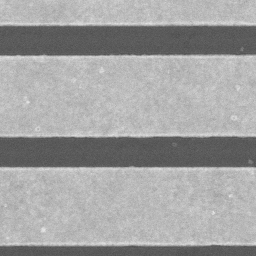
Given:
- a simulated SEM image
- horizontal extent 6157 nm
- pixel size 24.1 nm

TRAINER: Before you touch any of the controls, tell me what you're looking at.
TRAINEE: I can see lines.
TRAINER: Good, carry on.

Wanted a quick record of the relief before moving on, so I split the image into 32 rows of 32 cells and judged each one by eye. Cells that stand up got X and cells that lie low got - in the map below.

XXXXXXXXXXXXXXXXXXXXXXXXXXXXXXXX
XXXXXXXXXXXXXXXXXXXXXXXXXXXXXXXX
XXXXXXXXXXXXXXXXXXXXXXXXXXXXXXXX
--------------------------------
--------------------------------
--------------------------------
--------------------------------
XXXXXXXXXXXXXXXXXXXXXXXXXXXXXXXX
XXXXXXXXXXXXXXXXXXXXXXXXXXXXXXXX
XXXXXXXXXXXXXXXXXXXXXXXXXXXXXXXX
XXXXXXXXXXXXXXXXXXXXXXXXXXXXXXXX
XXXXXXXXXXXXXXXXXXXXXXXXXXXXXXXX
XXXXXXXXXXXXXXXXXXXXXXXXXXXXXXXX
XXXXXXXXXXXXXXXXXXXXXXXXXXXXXXXX
XXXXXXXXXXXXXXXXXXXXXXXXXXXXXXXX
XXXXXXXXXXXXXXXXXXXXXXXXXXXXXXXX
XXXXXXXXXXXXXXXXXXXXXXXXXXXXXXXX
--------------------------------
--------------------------------
--------------------------------
--------------------------------
XXXXXXXXXXXXXXXXXXXXXXXXXXXXXXXX
XXXXXXXXXXXXXXXXXXXXXXXXXXXXXXXX
XXXXXXXXXXXXXXXXXXXXXXXXXXXXXXXX
XXXXXXXXXXXXXXXXXXXXXXXXXXXXXXXX
XXXXXXXXXXXXXXXXXXXXXXXXXXXXXXXX
XXXXXXXXXXXXXXXXXXXXXXXXXXXXXXXX
XXXXXXXXXXXXXXXXXXXXXXXXXXXXXXXX
XXXXXXXXXXXXXXXXXXXXXXXXXXXXXXXX
XXXXXXXXXXXXXXXXXXXXXXXXXXXXXXXX
XXXXXXXXXXXXXXXXXXXXXXXXXXXXXXXX
--------------------------------